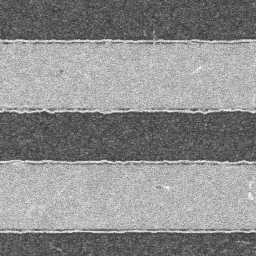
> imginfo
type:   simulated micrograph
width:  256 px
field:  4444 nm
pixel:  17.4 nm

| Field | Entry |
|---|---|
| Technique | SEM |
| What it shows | one or a few lines or trenches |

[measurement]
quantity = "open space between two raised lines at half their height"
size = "1200 nm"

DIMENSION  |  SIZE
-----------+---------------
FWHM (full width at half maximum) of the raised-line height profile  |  896 nanometers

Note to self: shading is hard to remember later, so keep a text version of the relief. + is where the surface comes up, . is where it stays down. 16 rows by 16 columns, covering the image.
++++++++++++++++
++++++++++++++++
++++++++++++++++
................
................
................
................
++++++++++++++++
++++++++++++++++
++++++++++++++++
................
................
................
................
++++++++++++++++
++++++++++++++++